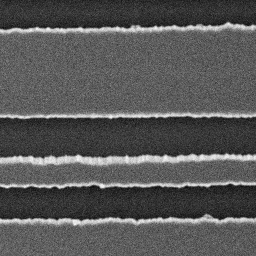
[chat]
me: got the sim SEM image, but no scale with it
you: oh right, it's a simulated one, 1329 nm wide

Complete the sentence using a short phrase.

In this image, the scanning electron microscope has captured lines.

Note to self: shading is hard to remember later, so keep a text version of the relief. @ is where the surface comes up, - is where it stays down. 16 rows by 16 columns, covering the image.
----------------
----------------
@@@@@@@@@@@@@@@@
@@@@@@@@@@@@@@@@
@@@@@@@@@@@@@@@@
@@@@@@@@@@@@@@@@
@@@@@@@@@@@@@@@@
----------------
----------------
----------------
@@@@@@@@@@@@@@@@
@@@@@@@@@@@@@@@@
----------------
----------------
@@@@@@@@@@@@@@@@
@@@@@@@@@@@@@@@@